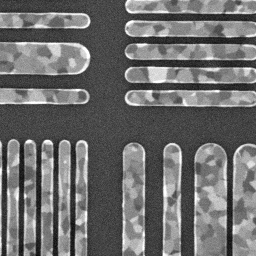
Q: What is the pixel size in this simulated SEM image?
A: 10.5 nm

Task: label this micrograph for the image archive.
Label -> groups of lines, slits or small figures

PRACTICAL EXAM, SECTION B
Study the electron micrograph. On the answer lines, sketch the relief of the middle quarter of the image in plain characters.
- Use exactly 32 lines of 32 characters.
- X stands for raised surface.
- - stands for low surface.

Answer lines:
XXXXX---------------------------
XXXXX-----------XXXXXXXXXXXXXXXX
----------------XXXXXXXXXXXXXXXX
----------------XXXXXXXXXXXXXXXX
------------------------------X-
--------------------------------
--------------------------------
XXXXXX----------XXXXXXXXXXXXXXXX
XXXXXX----------XXXXXXXXXXXXXXXX
XXXXX-----------XXXXXXXXXXXXXXXX
--------------------------------
--------------------------------
--------------------------------
--------------------------------
--------------------------------
--------------------------------
--------------------------------
--------------------------------
--------------------------------
X---X---------------------------
X--XXX----------XXX-------XX----
X--XXX---------XXXXX-----XXXX---
X--XXX---------XXXXX-----XXXX---
X--XXX---------XXXXX-----XXXX---
X--XX----------XXXXX-----XXXX---
X--XX----------XXXXX-----XXXX---
X--XX----------XXXXX-----XXXX---
X---X----------XXXXX-----XXXX---
X--XX----------XXXXX-----XXXX---
X--XXX---------XXXXX-----XXXX---
X--XXX---------XXXXX-----XXXX---
X--XXX---------XXXXX-----XXXX---